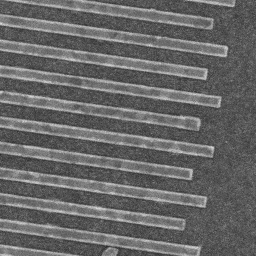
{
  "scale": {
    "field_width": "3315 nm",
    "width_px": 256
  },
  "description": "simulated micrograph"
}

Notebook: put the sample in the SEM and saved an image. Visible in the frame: parallel lines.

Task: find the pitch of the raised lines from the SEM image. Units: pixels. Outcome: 25.3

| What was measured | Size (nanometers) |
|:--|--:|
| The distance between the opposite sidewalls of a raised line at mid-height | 123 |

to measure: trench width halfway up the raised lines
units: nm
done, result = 213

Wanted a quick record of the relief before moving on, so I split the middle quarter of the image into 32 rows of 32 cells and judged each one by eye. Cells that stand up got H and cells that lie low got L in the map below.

LLLLLLLLLLLLHHHHHHHHHHHHHHHHLLLL
LLLLLLLLLLLLLLLLLLLHHHHHHHHHHHHH
LLLLLLLLLLLLLLLLLLLLLLLLLLHHHHHH
HHHHHLLLLLLLLLLLLLLLLLLLLLLLLLLL
HHHHHHHHHHHHLLLLLLLLLLLLLLLLLLLL
LLLHHHHHHHHHHHHHHHHLLLLLLLLLLLLL
LLLLLLLLLLHHHHHHHHHHHHHHHHLLLLLL
LLLLLLLLLLLLLLLLLHHHHHHHHHHHHHHH
LLLLLLLLLLLLLLLLLLLLLLLLHHHHHHHH
HHLLLLLLLLLLLLLLLLLLLLLLLLLLLLLH
HHHHHHHHHLLLLLLLLLLLLLLLLLLLLLLL
HHHHHHHHHHHHHHHHLLLLLLLLLLLLLLLL
LLLLLLHHHHHHHHHHHHHHHHHLLLLLLLLL
LLLLLLLLLLLLLLHHHHHHHHHHHHHHHHHH
LLLLLLLLLLLLLLLLLLLLLHHHHHHHHHHH
LLLLLLLLLLLLLLLLLLLLLLLLLLLHHHHH
HHHHHHHLLLLLLLLLLLLLLLLLLLLLLLLL
HHHHHHHHHHHHHHLLLLLLLLLLLLLLLLLL
LLLLLHHHHHHHHHHHHHHHHLLLLLLLLLLL
LLLLLLLLLLLHHHHHHHHHHHHHHHHHLLLL
LLLLLLLLLLLLLLLLLLLHHHHHHHHHHHHH
LLLLLLLLLLLLLLLLLLLLLLLLLLHHHHHH
HHHHLLLLLLLLLLLLLLLLLLLLLLLLLLLL
HHHHHHHHHHHLLLLLLLLLLLLLLLLLLLLL
LHHHHHHHHHHHHHHHHHLLLLLLLLLLLLLL
LLLLLLLLLHHHHHHHHHHHHHHHHLLLLLLL
LLLLLLLLLLLLLLLLHHHHHHHHHHHHHHHH
LLLLLLLLLLLLLLLLLLLLLLLHHHHHHHHH
LLLLLLLLLLLLLLLLLLLLLLLLLLLLLLHH
HHHHHHHHLLLLLLLLLLLLLLLLLLLLLLLL
HHHHHHHHHHHHHHLLLLLLLLLLLLLLLLLL
LLLLLHHHHHHHHHHHHHHHHLLLLLLLLLLL